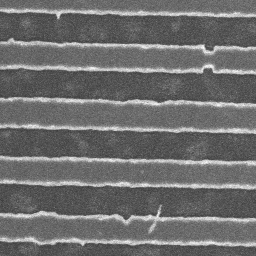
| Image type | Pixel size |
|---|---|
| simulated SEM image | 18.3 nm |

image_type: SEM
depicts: parallel lines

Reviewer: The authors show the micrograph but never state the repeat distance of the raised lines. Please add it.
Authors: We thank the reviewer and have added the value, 1050 nanometers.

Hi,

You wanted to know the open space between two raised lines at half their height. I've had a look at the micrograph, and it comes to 0.575 micrometres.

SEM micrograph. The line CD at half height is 468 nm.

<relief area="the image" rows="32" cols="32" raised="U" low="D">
UUUUUUUUUUUUUUUUUUUUUUUUUUUUUUUU
DDDDDDUUDDUUUUUUUUUUUUUUUUUUUUUU
DDDDDDDDDDDDDDDDDDDDDDDDDDDDDDDD
DDDDDDDDDDDDDDDDDDDDDDDDDDDDDDDD
DDDDDDDDDDDDDDDDDDDDDDDDDDDDDDDD
UUUUUUUDUUDDDDDDDDDDDDDDDDDDDDDD
UUUUUUUUUUUUUUUUUUUUUUUUUUUUUUUU
UUUUUUUUUUUUUUUUUUUUUUUUUUUUUUUU
DUDDUDDUUUUUUUUUUUUUUUUUUUUUUUUU
DDDDDDDDDDDDDDDDDDDDDDDDDDDDDDDD
DDDDDDDDDDDDDDDDDDDDDDDDDDDDDDDD
DDDDDDDDDDDDDDDDDDDDDDDDDDDDDDDD
UUUUUUUUUDDDDDDDDDDDDDDDDDDDDDDD
UUUUUUUUUUUUUUUUUUUUUUUUUUUUUUUU
UUUUUUUUUUUUUUUUUUUUUUUUUUUUUUUU
UUUUUUUUUUUUUUUUUUUUUUUUUUUUUUUU
DDDDDDDDDDDDDDDDDDDDDDDDDDDDDDDU
DDDDDDDDDDDDDDDDDDDDDDDDDDDDDDDD
DDDDDDDDDDDDDDDDDDDDDDDDDDDDDDDD
DDDDDDDDDDDDDDDDDDDDDDDDDDDDDDDD
UUUUUUUUUUUUUUUUUUUUUUUUUUUUUUUU
UUUUUUUUUUUUUUUUUUUUUUUUUUUUUUUU
UUUUUUUUUUUUUUUUUUUUUUUUUUUUUUUU
DDDDDDDDDDDDDDDDDDDDDDDDDDDDDDDD
DDDDDDDDDDDDDDDDDDDDDDDDDDDDDDDD
DDDDDDDDDDDDDDDDDDDDDDDDDDDDDDDD
DDDDDDDDDDDDDDDDDDDDDDDDDDDDDDDD
UUUUUUUUUUUUUUUDUUUUUUUUUUUUUUUU
UUUUUUUUUUUUUUUUUUUUUUUUUUUUUUUU
UUUUUUUUUUUUUUUUUUUUUUUUUUUUUUUU
DDDDDDDDDDDDDDDDDDDDDDUUUDDUDUUU
DDDDDDDDDDDDDDDDDDDDDDDDDDDDDDDD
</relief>